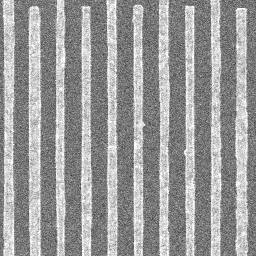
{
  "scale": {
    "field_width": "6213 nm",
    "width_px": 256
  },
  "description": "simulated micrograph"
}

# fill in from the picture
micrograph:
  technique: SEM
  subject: parallel lines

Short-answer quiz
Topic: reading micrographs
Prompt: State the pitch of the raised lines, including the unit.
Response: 0.627 micrometres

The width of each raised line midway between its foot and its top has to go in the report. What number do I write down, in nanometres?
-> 206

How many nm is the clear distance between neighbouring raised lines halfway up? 434